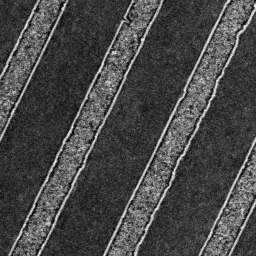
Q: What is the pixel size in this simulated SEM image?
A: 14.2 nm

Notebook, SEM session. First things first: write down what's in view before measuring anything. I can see one or a few lines or trenches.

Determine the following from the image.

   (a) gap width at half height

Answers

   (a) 58.9 px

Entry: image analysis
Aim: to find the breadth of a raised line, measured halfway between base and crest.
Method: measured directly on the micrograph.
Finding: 381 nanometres